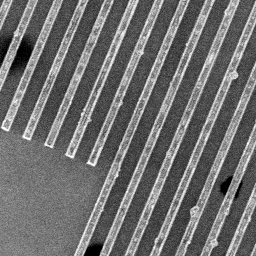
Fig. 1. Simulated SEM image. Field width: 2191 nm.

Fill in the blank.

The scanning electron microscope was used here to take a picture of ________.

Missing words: parallel lines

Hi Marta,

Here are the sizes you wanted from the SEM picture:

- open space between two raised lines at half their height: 0.138 microns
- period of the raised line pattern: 199 nanometres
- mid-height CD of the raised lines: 0.0612 microns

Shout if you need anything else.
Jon